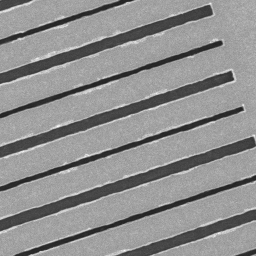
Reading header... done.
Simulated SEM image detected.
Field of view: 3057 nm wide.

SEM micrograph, parallel lines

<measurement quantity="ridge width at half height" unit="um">0.32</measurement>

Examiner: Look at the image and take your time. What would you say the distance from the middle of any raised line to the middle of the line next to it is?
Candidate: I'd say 34.7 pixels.